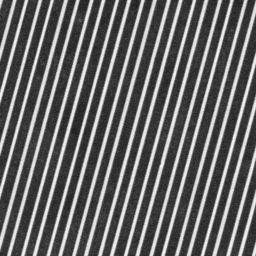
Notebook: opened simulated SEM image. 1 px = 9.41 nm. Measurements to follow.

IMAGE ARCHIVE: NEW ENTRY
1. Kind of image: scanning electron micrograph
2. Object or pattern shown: parallel lines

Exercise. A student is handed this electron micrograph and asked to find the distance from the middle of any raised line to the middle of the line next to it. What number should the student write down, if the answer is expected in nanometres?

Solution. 116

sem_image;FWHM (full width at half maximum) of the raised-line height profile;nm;20.5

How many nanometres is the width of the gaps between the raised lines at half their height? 94.3